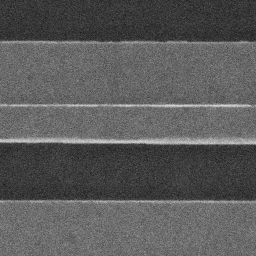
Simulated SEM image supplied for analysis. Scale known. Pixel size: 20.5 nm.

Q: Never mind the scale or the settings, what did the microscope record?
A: lines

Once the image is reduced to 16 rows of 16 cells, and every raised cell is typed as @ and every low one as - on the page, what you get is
----------------
----------------
----------------
@@@@@@@@@@@@@@@@
@@@@@@@@@@@@@@@@
@@@@@@@@@@@@@@@@
@@@@@@@@@@@@@@@@
@@@@@@@@@@@@@@@@
@@@@@@@@@@@@@@@@
----------------
----------------
----------------
----------------
@@@@@@@@@@@@@@@@
@@@@@@@@@@@@@@@@
@@@@@@@@@@@@@@@@